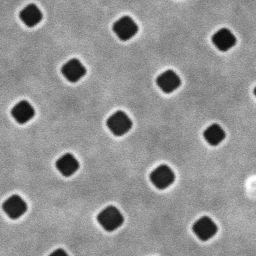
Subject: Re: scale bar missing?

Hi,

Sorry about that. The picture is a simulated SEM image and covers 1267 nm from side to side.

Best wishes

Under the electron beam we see a regular array of holes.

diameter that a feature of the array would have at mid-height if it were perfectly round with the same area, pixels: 24.3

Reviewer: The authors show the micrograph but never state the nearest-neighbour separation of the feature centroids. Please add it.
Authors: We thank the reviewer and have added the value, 330 nanometers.